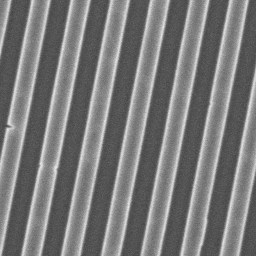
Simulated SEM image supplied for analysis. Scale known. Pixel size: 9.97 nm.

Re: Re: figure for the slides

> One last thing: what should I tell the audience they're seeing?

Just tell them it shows parallel lines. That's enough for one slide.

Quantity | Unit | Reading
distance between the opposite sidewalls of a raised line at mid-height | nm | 176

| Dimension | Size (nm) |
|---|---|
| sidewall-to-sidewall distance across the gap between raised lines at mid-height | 208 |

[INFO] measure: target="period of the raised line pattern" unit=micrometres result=0.388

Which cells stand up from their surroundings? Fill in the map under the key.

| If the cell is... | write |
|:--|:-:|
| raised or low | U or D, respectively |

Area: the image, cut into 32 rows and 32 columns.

UDDDUUDDDUUDDDUUDDDUUDDDUUDDDUUD
UDDDUUDDDUUDDDUUDDDUUDDDUUDDUUUD
UDDDUUDDUUUDDUUUDDUUUDDUUUDDUUUD
UDDUUUDDUUUDDUUDDDUUDDDUUDDDUUDD
DDDUUDDDUUDDDUUDDDUUDDDUUDDDUUDD
DDDUUDDDUUDDDUUDDDUUDDDUUDDDUUDD
DDDUUDDDUUDDDUUDDDUUDDDUUDDUUUDD
DDDUUDDUUUDDUUUDDUUUDDUUUDDUUUDD
DDUUUDDUUUDDUUUDDUUUDDUUDDDUUDDD
DDUUDDDUUDDDUUDDDUUDDDUUDDDUUDDD
DDUUDDDUUDDDUUDDDUUDDDUUDDDUUDDD
DDUUDDDUUDDDUUDDDUUDDDUUDDUUUDDD
DDUUDDUUUDDUUUDDUUUDDUUUDDUUUDDU
DUUUDDUUUDDUUUDDUUUDDUUDDDUUDDDU
DUUDDDUUDDDUUDDDUUDDDUUDDDUUDDDU
DUUDDDUUDDDUUDDDUUDDDUUDDDUUDDDU
DUUDDDUUDDDUUDDDUUDDDUUDDDUUDDDU
DUUDDDUUDDDUUDDDUUDDUUUDDUUUDDUU
UUUDDUUUDDUUUDDUUUDDUUUDDUUDDDUU
UUDDDUUDDDUUDDDUUDDDUUDDDUUDDDUU
UUDDDUUDDDUUDDDUUDDDUUDDDUUDDDUU
UUDDDUUDDDUUDDDUUDDDUUDDDUUDDDUU
UUDDDUUDDDUUDDDUUDDUUUDDUUUDDUUU
UUDDUUUDDUUUDDUUUDDUUUDDUUUDDUUD
UUDDUUUDDUUDDDUUDDDUUDDDUUDDDUUD
UDDDUUDDDUUDDDUUDDDUUDDDUUDDDUUD
UDDDUUDDDUUDDDUUDDDUUDDDUUDDDUUD
UDDDUUDDDUUDDDUUDDDUUDDUUUDDUUUD
UDDUUUDDUUUDDUUUDDUUUDDUUUDDUUDD
UDDUUUDDUUDDDUUDDDUUDDDUUDDDUUDD
DDDUUDDDUUDDDUUDDDUUDDDUUDDDUUDD
DDDUUDDDUUDDDUUDDDUUDDDUUDDDUUDD